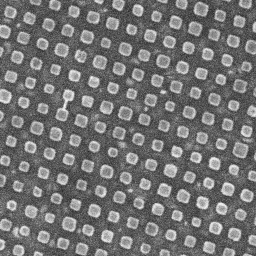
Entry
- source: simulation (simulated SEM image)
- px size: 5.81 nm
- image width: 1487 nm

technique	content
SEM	a regular array of raised bodies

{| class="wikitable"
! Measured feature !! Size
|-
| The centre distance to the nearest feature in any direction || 116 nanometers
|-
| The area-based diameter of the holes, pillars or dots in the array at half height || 64.6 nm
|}